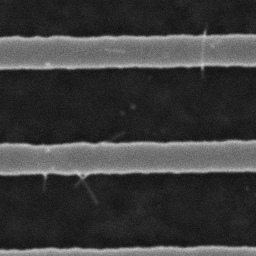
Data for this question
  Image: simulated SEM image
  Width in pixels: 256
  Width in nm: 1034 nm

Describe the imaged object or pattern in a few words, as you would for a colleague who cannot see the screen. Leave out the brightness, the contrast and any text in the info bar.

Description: lines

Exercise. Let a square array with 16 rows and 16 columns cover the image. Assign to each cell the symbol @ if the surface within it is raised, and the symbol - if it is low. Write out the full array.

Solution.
----------------
----------------
@@@@@@@@@@@@@@@@
@@@@@@@@@@@@@@@@
----------------
----------------
----------------
----------------
----------------
@@@@@@@@@@@@@@@@
@@@@@@@@@@@@@@@@
----------------
----------------
----------------
----------------
--------@@@@@@@@